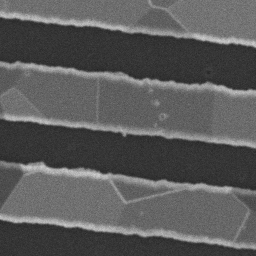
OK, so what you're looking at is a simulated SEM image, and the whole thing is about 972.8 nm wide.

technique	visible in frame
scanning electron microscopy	lines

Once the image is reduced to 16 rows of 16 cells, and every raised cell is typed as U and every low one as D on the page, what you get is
UUUUUUUUUUUUUUUU
DDDDDUUUUUUUUUUU
DDDDDDDDDDDDDUUU
DDDDDDDDDDDDDDDD
UUUUUDDDDDDDDDDD
UUUUUUUUUUUUUUDD
UUUUUUUUUUUUUUUU
DDUUUUUUUUUUUUUU
DDDDDDDDDDDUUUUU
DDDDDDDDDDDDDDDD
UUUDDDDDDDDDDDDD
UUUUUUUUUUUDDDDD
UUUUUUUUUUUUUUUU
UUUUUUUUUUUUUUUU
DDDDDDDDUUUUUUUU
DDDDDDDDDDDDDDDD